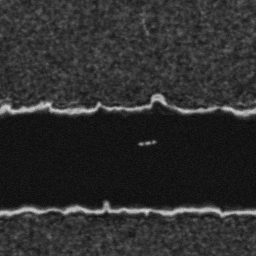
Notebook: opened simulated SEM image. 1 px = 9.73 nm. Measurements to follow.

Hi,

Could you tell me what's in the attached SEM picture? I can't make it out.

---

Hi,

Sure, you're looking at one or a few lines or trenches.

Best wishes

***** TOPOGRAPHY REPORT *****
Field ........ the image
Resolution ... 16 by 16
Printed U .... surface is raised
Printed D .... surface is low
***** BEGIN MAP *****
DDDDDDDDDDDDDDDD
DDDDDDDDDDDDDDDD
DDDDDDDDDDDDDDDD
DDDDDDDDDDDDDDDD
DDDDDDDDDDDDDDDD
DDDDDDDDDDDDDDDD
DDDDDDDDDUDDDDDD
UUUUUUUUUUUUUUUU
UUUUUUUUUUUUUUUU
UUUUUUUUUUUUUUUU
UUUUUUUUUUUUUUUU
UUUUUUUUUUUUUUUU
UUUUUUUUUUUUUUUU
DDDDDDDDDDDDDDDD
DDDDDDDDDDDDDDDD
DDDDDDDDDDDDDDDD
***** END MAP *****